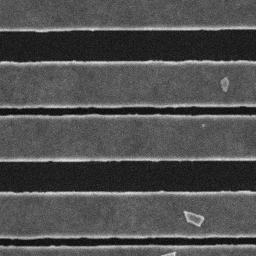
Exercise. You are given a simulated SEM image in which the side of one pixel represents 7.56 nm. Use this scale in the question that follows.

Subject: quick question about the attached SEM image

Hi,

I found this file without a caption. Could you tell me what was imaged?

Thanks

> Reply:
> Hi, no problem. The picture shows lines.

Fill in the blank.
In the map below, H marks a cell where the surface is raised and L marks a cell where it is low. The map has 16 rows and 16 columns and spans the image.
HHHHHHHHHHHHHHHH
HHHHHHHHHHHHHHHH
LLLLLLLLLLLLLLLL
LLLLLLLLLLLLLLLL
HHHHHHHHHHHHHHHH
HHHHHHHHHHHHHHHH
HHHHHHHHHHHHHHHH
HHHHHHHHHHHHHHHH
HHHHHHHHHHHHHHHH
HHHHHHHHHHHHHHHH
LLLLLLLLLLLLLLLL
LLLLLLLLLLLLLLLL
HHHHHHHHHHHHHHHH
HHHHHHHHHHHHHHHH
HHHHHHHHHHHHHHHH
HHHHHHHHHHHHHHHH